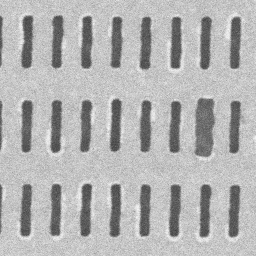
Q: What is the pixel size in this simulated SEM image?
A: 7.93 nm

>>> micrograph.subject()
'a regular array of holes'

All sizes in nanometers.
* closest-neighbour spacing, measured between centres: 234